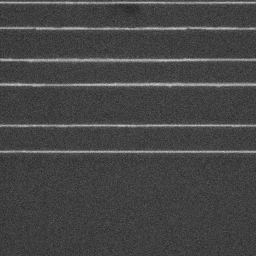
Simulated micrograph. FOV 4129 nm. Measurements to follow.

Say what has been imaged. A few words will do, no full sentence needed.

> lines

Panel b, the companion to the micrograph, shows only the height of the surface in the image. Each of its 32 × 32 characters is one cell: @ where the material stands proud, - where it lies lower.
@@@@@@@@@@@@@@@@@@@@@@@@@@@@@@@@
@@@@@@@@@@@@@@@@@@@@@@@@@@@@@@@@
@@@@@@@@@@@@@@@@@@@@@@@@@@@@@@@@
----@@@@@@@@@@@@@@@@@@@@--@@@@@@
--------------------------------
--------------------------------
--------------------------------
@@@@@@@@@@@@@@@@@@@@@@@@@@@@@@@@
@@@@@@@@@@@@@@@@@@@@@@@@@@@@@@@@
@@@@@@@@@@@@@@@@@@@@@@@@@@@@@@@@
@@@@@@@@@@@@@@@@@@@@@@@@@@@@@@@@
--------------------------------
--------------------------------
--------------------------------
--------------------------------
--------------------------------
@@@@@@@@@@@@@@@@@@@@@@@@@@@@@@@@
@@@@@@@@@@@@@@@@@@@@@@@@@@@@@@@@
@@@@@@@@@@@@@@@@@@@@@@@@@@@@@@@@
--------------------------------
--------------------------------
--------------------------------
--------------------------------
--------------------------------
--------------------------------
--------------------------------
--------------------------------
--------------------------------
--------------------------------
--------------------------------
--------------------------------
--------------------------------